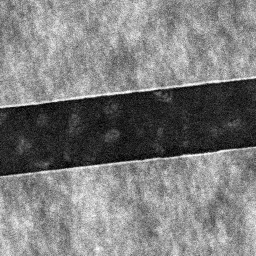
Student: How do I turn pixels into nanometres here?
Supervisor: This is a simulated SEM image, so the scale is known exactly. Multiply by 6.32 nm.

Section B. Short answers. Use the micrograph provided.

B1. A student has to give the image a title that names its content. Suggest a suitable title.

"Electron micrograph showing one or a few lines or trenches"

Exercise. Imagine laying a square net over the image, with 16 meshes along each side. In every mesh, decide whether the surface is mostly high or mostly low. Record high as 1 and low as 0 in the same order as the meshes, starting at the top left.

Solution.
1111111111111111
1111111111111111
1111111111111111
1111111111111111
1111111111111111
1111111111000000
1100000000000000
0000000000000000
0000000000000000
0000000000000011
0000011111111111
1111111111111111
1111111111111111
1111111111111111
1111111111111111
1111111111111111